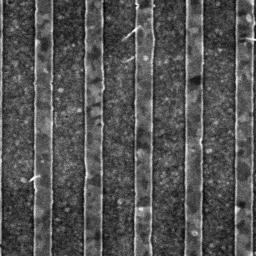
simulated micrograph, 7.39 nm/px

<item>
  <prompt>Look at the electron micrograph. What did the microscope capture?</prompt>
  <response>parallel lines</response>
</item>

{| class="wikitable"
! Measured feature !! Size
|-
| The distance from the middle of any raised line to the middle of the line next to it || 371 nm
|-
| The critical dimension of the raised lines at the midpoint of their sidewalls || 127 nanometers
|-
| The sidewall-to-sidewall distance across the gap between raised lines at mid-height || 248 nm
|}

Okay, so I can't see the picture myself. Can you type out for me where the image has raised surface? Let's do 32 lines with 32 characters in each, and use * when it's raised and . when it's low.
.....**....**....**....**.....**
....***....**....**....**.....**
.....**....**....**....**.....**
....***....**....**....**.....**
....***....**....**....**.....**
....***....**....**....**.....**
....***....**....**....**.....**
....***....**....**....**.....**
....**.....**....**....**.....**
....***....**....**....**....***
....**.....**....**....**.....**
....**.....**....**....**.....**
....**.....**....**....**.....**
....***....**....**....**.....**
....**.....**....**....**.....**
....**.....**....**....**.....**
....**.....**....**....**.....**
....**.....**....**....**.....**
....**.....**....**....**.....**
....**.....**....**....**.....**
....***....**....**....**....***
....**.....**....**....**.....**
....**.....**....**....**.....**
....***....**....**....**....***
....***....**....**....**....***
....***....**....**....**....***
....**.....**....**....**....***
....**.....**....**....**....**.
....**.....**....**....**....**.
....**.....**....**....**....***
....**.....**....**....**....**.
....**.....**....**....**....**.